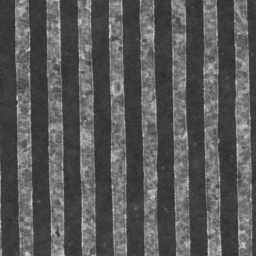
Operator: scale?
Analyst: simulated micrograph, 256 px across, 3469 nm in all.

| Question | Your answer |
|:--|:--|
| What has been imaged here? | parallel lines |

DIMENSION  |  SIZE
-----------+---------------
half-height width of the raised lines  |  169 nm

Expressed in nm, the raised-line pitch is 424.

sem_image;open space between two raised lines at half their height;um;0.244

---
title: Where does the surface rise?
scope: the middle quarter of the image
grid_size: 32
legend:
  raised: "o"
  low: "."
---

....ooo.....ooo....oooo....ooo..
....ooo.....ooo.....ooo....ooo..
....ooo.....ooo.....ooo....ooo..
....ooo.....ooo.....ooo....ooo..
....ooo.....ooo.....ooo....ooo..
....ooo.....ooo.....ooo....ooo..
....ooo.....ooo.....ooo....ooo..
....ooo.....ooo.....ooo....ooo..
....ooo.....ooo....oooo....ooo..
....ooo.....ooo....oooo....ooo..
....ooo.....ooo....oooo....ooo..
....ooo.....ooo.....o.o....ooo..
....ooo.....ooo.....ooo.....oo..
....ooo.....ooo.....ooo.....oo..
....ooo.....ooo.....ooo.....oo..
....ooo.....ooo.....ooo....ooo..
....ooo.....ooo.....o.o.....ooo.
....ooo.....ooo.....ooo.....ooo.
....ooo.....ooo.....ooo.....ooo.
....oooo....ooo.....ooo.....ooo.
....ooo.....ooo.....ooo.....ooo.
....ooo.....ooo.....ooo.....ooo.
....ooo.....ooo.....ooo.....ooo.
....ooo.....ooo.....ooo.....ooo.
....oooo....ooo.....ooo.....ooo.
....ooo.....ooo.....ooo.....ooo.
....ooo.....ooo.....ooo.....ooo.
....oooo....ooo.....ooo.....ooo.
....oooo....ooo.....ooo.....ooo.
....oooo....ooo.....ooo.....ooo.
....oooo....ooo.....ooo.....ooo.
.....ooo....ooo.....ooo.....ooo.